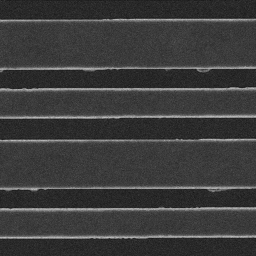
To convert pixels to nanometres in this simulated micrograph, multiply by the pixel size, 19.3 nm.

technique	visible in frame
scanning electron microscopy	lines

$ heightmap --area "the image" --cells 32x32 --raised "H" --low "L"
LLLLLLLLLLLLLLLLLLLLLLLLLLLLLLLL
LLLLLLLLLLLLLLLLLLLLLLLLLLLLLLLL
LLLLLLLLLLLLLLHHHHHHHHHHHHHHHHHH
HHHHHHHHHHHHHHHHHHHHHHHHHHHHHHHH
HHHHHHHHHHHHHHHHHHHHHHHHHHHHHHHH
HHHHHHHHHHHHHHHHHHHHHHHHHHHHHHHH
HHHHHHHHHHHHHHHHHHHHHHHHHHHHHHHH
HHHHHHHHHHHHHHHHHHHHHHHHHHHHHHHH
HHHHHHHHHHHHHHHHHHHHHHHHHHHHHHHH
LLLLLLLLLLLLLLLLLLLLLLLLLLLLLLLL
LLLLLLLLLLLLLLLLLLLLLLLLLLLLLLLL
HHHHHHHHHHHHHHHHHHHHHHHHHHHHHHHH
HHHHHHHHHHHHHHHHHHHHHHHHHHHHHHHH
HHHHHHHHHHHHHHHHHHHHHHHHHHHHHHHH
HHHHHHHHHHHHHHHHHHHHHHHHHHHHHHHH
LLLLLLLLLLLLLLLLLLLLLLLLLLLLLLLL
LLLLLLLLLLLLLLLLLLLLLLLLLLLLLLLL
LLLLLLLLLLLLLLLLLLLLLLLLLHHHHHHH
HHHHHHHHHHHHHHHHHHHHHHHHHHHHHHHH
HHHHHHHHHHHHHHHHHHHHHHHHHHHHHHHH
HHHHHHHHHHHHHHHHHHHHHHHHHHHHHHHH
HHHHHHHHHHHHHHHHHHHHHHHHHHHHHHHH
HHHHHHHHHHHHHHHHHHHHHHHHHHHHHHHH
HHHHHHHHHHHHHHHHHHHHHHHHHHHHHHHH
LLLLLLLLLLLLLLLLLLLLLLLLLLLLLLLL
LLLLLLLLLLLLLLLLLLLLLLLLLLLLLLLL
HHHHHHHHHHHHHHHHHHHHHHHHHHHHHHHH
HHHHHHHHHHHHHHHHHHHHHHHHHHHHHHHH
HHHHHHHHHHHHHHHHHHHHHHHHHHHHHHHH
HHHHHHHHHHHHHHHHHHHHHHHHHHHHHHHH
LLLLLLLLLLLLLLLLLLLLLLLLLLLLLLLL
LLLLLLLLLLLLLLLLLLLLLLLLLLLLLLLL